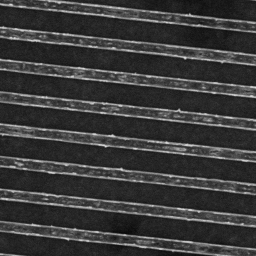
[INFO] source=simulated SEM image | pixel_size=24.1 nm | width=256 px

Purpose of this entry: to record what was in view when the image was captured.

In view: parallel lines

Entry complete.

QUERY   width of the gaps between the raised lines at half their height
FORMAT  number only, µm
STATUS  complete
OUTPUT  0.529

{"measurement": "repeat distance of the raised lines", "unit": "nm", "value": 774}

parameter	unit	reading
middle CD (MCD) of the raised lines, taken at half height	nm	242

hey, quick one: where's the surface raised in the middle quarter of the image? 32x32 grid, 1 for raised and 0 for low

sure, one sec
00000000000000000000000000000000
11111110100000000000000000000000
11111111111111110100000000000000
00001111111111111111111111000000
00000000000001111111111111111111
00000000000000000000001111111111
00000000000000000000000000000001
00000000000000000000000000000000
00000000000000000000000000000000
11111110000000000000000000000000
11111111111111110000000000000000
00111111111111111111111111001000
00000000000001111111111111111111
00000000000000000000011111111111
00000000000000000000000000000001
00000000000000000000000000000000
00000000000000000000000000000000
11111101000000000000000000000000
11111111111111100000000000000000
00011111111111111111111111000000
00000000001111111111111111111111
00000000000000000000111111111111
00000000000000000000000000000101
00000000000000000000000000000000
00000000000000000000000000000000
11111100000000000000000000000000
11111111111111100000000000000000
11111111111111111111111100000000
00000000001111111111111111111110
00000000000000000001011111111111
00000000000000000000000000000011
00000000000000000000000000000000